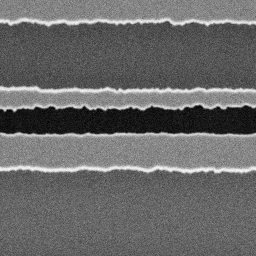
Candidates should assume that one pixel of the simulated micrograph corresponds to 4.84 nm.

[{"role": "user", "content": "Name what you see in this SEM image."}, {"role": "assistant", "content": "lines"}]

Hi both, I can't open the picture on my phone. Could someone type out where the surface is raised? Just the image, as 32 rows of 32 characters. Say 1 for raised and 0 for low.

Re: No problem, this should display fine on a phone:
11111111111111111111111111111111
11111111111111111111111111111111
11111111111111111111111111111111
00000000000000000000000000000000
00000000000000000000000000000000
00000000000000000000000000000000
00000000000000000000000000000000
00000000000000000000000000000000
00000000000000000000000000000000
00000000000000000000000000000000
00000000000000000000000000000000
11111111111111111111111111111111
11111111111111111111111111111111
11110001000111110100111000100000
00000000000000000000000000000000
00000000000000000000000000000000
00000000000000000000000000000000
11111111111111111111111111111111
11111111111111111111111111111111
11111111111111111111111111111111
11111111111111111111111111111111
00000000000000000000000000000000
00000000000000000000000000000000
00000000000000000000000000000000
00000000000000000000000000000000
00000000000000000000000000000000
00000000000000000000000000000000
00000000000000000000000000000000
00000000000000000000000000000000
00000000000000000000000000000000
00000000000000000000000000000000
00000000000000000000000000000000